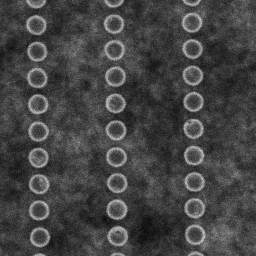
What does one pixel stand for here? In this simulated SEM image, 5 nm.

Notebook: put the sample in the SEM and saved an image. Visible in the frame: a regular array of raised bodies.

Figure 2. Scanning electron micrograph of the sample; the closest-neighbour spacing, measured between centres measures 0.132 micrometres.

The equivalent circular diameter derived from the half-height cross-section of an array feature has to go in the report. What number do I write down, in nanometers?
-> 91